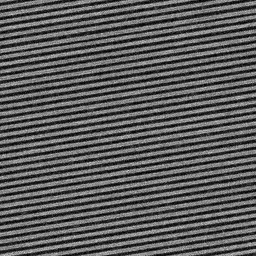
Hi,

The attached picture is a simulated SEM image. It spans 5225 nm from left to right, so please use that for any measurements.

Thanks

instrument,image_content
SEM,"parallel lines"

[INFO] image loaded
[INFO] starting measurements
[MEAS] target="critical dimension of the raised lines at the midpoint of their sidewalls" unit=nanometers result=58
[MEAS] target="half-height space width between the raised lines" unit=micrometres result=0.0882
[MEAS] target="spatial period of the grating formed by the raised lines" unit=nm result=143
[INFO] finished